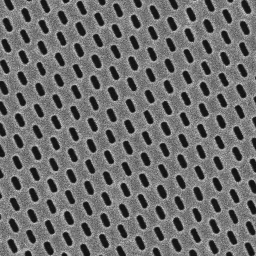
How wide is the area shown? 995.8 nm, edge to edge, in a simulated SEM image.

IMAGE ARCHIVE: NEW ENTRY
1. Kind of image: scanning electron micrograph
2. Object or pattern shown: a regular array of holes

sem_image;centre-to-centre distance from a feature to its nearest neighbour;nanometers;80.5